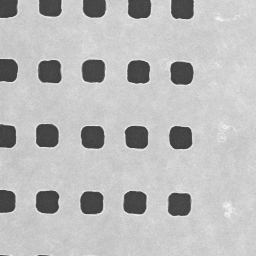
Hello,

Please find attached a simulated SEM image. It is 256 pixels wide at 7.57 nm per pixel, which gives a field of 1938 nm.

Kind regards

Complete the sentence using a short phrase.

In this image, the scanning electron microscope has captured a regular array of holes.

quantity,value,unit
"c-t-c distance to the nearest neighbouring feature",0.332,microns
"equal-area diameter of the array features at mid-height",186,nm